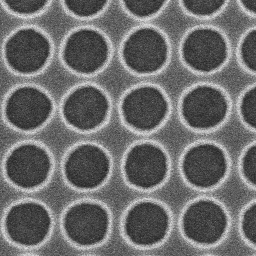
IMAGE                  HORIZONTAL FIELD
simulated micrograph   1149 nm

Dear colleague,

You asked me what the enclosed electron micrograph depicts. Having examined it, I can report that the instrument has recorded a regular array of holes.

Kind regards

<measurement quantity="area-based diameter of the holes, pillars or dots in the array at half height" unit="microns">0.208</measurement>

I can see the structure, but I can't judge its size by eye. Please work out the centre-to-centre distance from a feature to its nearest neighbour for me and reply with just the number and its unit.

0.258 micrometres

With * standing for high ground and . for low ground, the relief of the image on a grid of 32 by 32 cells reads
*.....**.....**......**.....**..
**...****...****....****...****.
********************************
***.**************.******.******
*.....***....***....***.....***.
*.....**......*......**.....**..
*.....**......*......**.....**..
*.....**.....**......**.....**..
*....****....***....****...****.
********************************
********************************
*.....***....***....***.....***.
*.....**......*......**.....**..
*......*......*......**......*..
*.....**.....**......**.....**..
*....****....***....***....****.
********************************
********************************
**...****...****....****....***.
*.....**......**.....**.....**..
*.....**......**.....**.....**..
*.....**......**.....**.....**..
*.....**.....***.....**.....***.
***.******..*****..******.******
********************************
**...****...*****...****...*****
*.....**.....***.....**.....**..
*.....**......*......**.....**..
*.....**......*......**.....**..
*.....**.....***.....**.....***.
**...****...*****...*****..****.
********************************